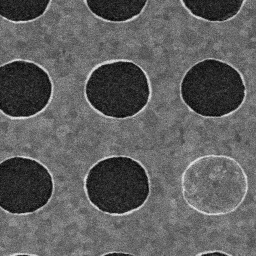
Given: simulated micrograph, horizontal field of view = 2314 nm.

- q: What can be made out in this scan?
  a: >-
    holes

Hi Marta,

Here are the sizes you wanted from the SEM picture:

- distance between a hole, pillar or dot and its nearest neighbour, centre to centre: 865 nm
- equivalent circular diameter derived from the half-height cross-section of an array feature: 552 nm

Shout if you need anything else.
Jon